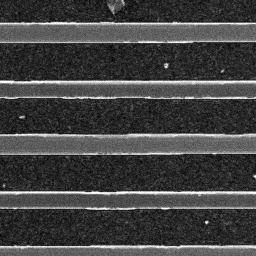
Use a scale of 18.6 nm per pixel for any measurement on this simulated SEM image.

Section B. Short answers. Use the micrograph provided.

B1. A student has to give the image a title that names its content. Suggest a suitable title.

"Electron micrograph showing lines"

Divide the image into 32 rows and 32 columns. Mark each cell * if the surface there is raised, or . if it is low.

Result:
..............*.................
................................
................................
********************************
********************************
................................
................................
................................
................................
................................
********************************
********************************
................................
................................
................................
................................
................................
********************************
********************************
................................
................................
................................
................................
................................
********************************
********************************
................................
................................
................................
................................
................................
********************************